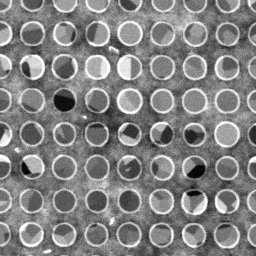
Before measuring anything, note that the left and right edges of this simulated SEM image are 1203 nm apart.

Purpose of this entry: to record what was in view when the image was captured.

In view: a regular array of raised bodies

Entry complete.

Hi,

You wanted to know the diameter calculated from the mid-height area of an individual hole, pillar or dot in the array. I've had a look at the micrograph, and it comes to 23.4 px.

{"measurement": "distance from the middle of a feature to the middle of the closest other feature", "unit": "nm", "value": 152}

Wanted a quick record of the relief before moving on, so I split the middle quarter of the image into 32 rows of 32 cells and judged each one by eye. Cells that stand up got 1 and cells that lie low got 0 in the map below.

11100111111000111110001111100011
11100111111000111110001111100011
11100011111000111110001111100011
11000001100000011000000111000000
00000000000000000000000000000000
00000000000000000000000000000000
10000001100000001100000011000000
11000011111000111110000111100011
11100011111000111110001111100011
11100011111000111110001111100011
11100011111000111110001111100011
11000001110000011100000111000001
00000000000000000000000000000000
00000000000000000000000000000000
00000000000000000000000000000000
11000011110000011100000111100001
11100011111000111110001111100011
11100111111000111110001111100011
11100011111000111110001111100011
11000011110000011100000111100011
00000000000000000000000000000000
00000000000000000000000000000000
00000000000000000000000000000000
11000001110000011100000111000001
11100011111000111110001111100011
11100111111001111110001111100011
11100111111001111110001111100011
11100011111000111110001111100011
10000001110000011100000111000001
00000000000000000000000000000000
00000000000000000000000000000000
10000000000000011000000000000000